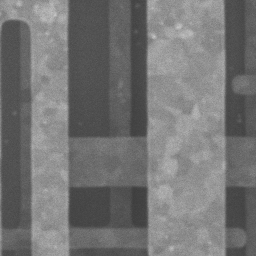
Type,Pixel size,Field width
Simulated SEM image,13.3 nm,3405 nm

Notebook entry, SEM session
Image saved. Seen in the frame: wiring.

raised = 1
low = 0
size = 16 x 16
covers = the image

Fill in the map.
1111000001111100
0011000001111100
0011000001111100
0011000001111100
0011000001111100
0011000001111100
0011000001111100
0011000001111100
0011000001111100
0011000001111100
0011000001111100
0011000001111100
0011000001111100
0011000001111100
0011000001111100
0011000001111100